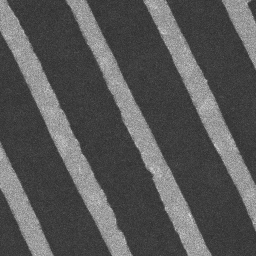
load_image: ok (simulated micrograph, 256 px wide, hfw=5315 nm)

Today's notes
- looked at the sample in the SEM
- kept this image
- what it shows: one or a few lines or trenches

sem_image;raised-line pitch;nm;1460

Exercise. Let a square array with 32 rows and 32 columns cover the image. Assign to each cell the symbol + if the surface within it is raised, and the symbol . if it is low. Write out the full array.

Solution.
.++++++++..+++++++...+++++++...+
..+++++++..++++++++..++++++++..+
..++++++++..+++++++...+++++++...
...+++++++..++++++++..+++++++...
...++++++++..+++++++...+++++++..
+...+++++++..++++++++..++++++++.
++..++++++++..+++++++...+++++++.
++...+++++++..++++++++..+++++++.
+++..++++++++..+++++++...+++++++
+++...+++++++..++++++++..+++++++
+++...+++++++...+++++++...++++++
++++...+++++++..++++++++..++++++
++++...+++++++...+++++++...+++++
+++++...+++++++..++++++++..+++++
+++++...+++++++...+++++++...++++
++++++...+++++++..+++++++...++++
++++++...+++++++...+++++++...+++
+++++++...+++++++..+++++++...+++
+++++++...+++++++...+++++++...++
.+++++++..++++++++..++++++++..++
.+++++++...+++++++...+++++++...+
..+++++++...+++++++..++++++++..+
..+++++++...+++++++...+++++++...
...+++++++...+++++++..++++++++..
+..+++++++...+++++++...+++++++..
+...+++++++...+++++++..++++++++.
++..+++++++...+++++++...+++++++.
++...+++++++..+++++++...+++++++.
+++..+++++++...+++++++...+++++++
+++..++++++++..+++++++...+++++++
+++...+++++++...+++++++...++++++
++++..++++++++..+++++++...++++++